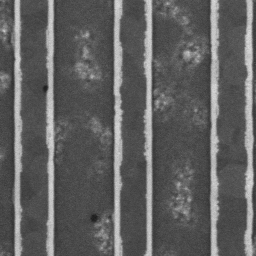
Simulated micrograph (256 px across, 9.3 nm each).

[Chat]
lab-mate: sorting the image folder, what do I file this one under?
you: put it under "one or a few lines or trenches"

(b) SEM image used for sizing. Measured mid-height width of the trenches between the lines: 611 nanometers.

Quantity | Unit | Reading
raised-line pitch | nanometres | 920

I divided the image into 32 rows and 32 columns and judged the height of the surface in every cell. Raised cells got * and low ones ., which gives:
..****.........****........****.
..****.........****........****.
..****.........****........****.
..****.........****........****.
..****.........****........****.
..****.........****........****.
..****.........****........****.
..****.........****........****.
..****.........****........****.
..****.........****........****.
..****.........****........****.
..****.........****........****.
..****.........****........****.
..****.........****........****.
..****.........****........****.
..****.........****........****.
..****.........****........****.
..****.........****........****.
..****.........****........****.
..****.........****........****.
..****.........****........****.
..****.........****........****.
..****.........****........****.
..****.........****........****.
..****.........****........****.
..****.........****........****.
..****.........****........****.
..****.........****........****.
..****.........****........****.
..****.........****........****.
..****.........****........****.
..****.........****........****.